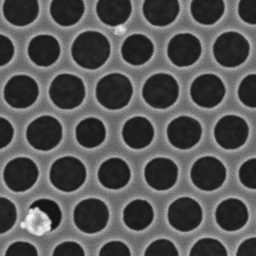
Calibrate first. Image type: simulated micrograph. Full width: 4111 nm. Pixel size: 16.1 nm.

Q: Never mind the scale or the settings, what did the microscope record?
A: a regular array of holes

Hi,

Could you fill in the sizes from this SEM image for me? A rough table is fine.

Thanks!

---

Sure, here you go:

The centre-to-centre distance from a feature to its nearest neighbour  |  747 nm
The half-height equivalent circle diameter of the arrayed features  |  564 nm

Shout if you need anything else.